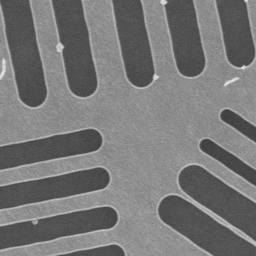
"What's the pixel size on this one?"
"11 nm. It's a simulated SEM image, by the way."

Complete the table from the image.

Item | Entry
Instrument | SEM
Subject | groups of lines, slits or small figures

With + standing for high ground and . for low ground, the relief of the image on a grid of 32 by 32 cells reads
....++....++++....+++...+++....+
....+++....+++....+++...+++....+
....+++....+++....+++....++....+
+...+++....++++...+++....+++...+
+....++....++++....++....+++....
+....+++...++++....++....+++....
+....+++...++++....+++...+++....
+....+++....+++....+++....++....
++...+++....++++...+++...+++++++
++....++....++++...++++.++++++++
++....++....++++...+++++++++++++
++....+++...++++++++++++++++++++
+++...++++++++++++++++++++++++++
++++++++++++++++++++++++++++++++
++++++++++++++++++++++++++++..++
++++++++++++++++++++++++++++...+
+++++++++...++++++++++++++++++..
++++.........++++++++++++.+++++.
............+++++++++++++...++++
.........+++++++++++++++++...+++
....++++++++++++++++++++++++...+
+++++++++....++++++++++...+++...
++++..........++++++++......+++.
.............++++++++++......+++
.........++++++++++++.++.......+
....++++++++++++++++....+.......
+++++++++.....++++++......+.....
++++...........+++++.......+....
..............+++++++...........
.........++++++++++++++.......+.
....++++++++++++++++++++........
+++++++++.......++++++++++......